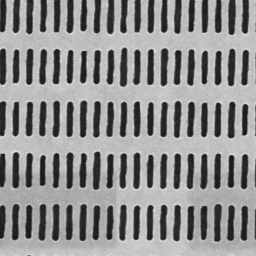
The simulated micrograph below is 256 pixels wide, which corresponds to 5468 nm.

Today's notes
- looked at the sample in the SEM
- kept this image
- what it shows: a regular array of holes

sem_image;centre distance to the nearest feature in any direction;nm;284